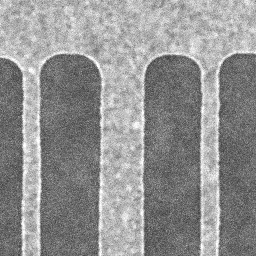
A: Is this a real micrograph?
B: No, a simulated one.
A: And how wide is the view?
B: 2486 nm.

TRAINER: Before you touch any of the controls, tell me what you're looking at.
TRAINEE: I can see one or a few lines or trenches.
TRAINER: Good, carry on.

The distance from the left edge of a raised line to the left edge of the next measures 866 nanometers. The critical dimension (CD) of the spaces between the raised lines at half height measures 58.9 pixels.